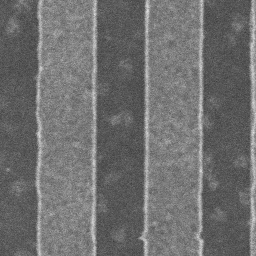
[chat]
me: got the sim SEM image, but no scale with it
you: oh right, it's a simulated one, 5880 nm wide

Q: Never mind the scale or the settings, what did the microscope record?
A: one or a few lines or trenches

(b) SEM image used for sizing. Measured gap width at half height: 1220 nm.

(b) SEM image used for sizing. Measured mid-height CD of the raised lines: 1240 nm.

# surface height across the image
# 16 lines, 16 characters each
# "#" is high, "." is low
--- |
..####...####...
..####...####...
...###...####...
..####...###....
..####...####...
..####...####...
..####...####...
..####...####...
..####...####...
...###...####...
..####...####...
..####...####...
..####...###....
..####...####...
..####...####...
..####...####...